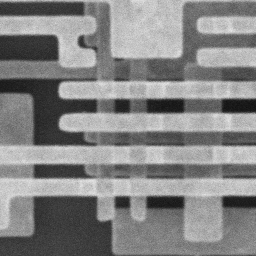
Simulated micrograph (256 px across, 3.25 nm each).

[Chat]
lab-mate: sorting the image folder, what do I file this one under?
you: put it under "wiring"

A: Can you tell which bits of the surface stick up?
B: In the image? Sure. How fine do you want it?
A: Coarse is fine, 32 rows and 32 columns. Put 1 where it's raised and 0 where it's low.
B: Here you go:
00000000000011111111111000000000
00000000000011111111111000000000
11111111111111111111111001111111
11111111111111111111111001111111
00000001110011111111111000000000
00000001110011111111111000000000
00000001111111111111111001111111
00000001111111001100000001111111
00000000000011001100000111110000
00000000000011001100000111110000
00000000111111111111111111111111
00000001111111111111111111111111
00000000000011101110000111110000
00000000000011001100000111110000
00000000111111111111111111111111
00000000111111111111111111111111
00000000000011101110000111110000
00000000000011001100000111110000
11111111111111111111111111111111
11111111111111111111111111111111
00000000000011101110000111110000
00000000000011001100000111110000
11111111111111111111111111111111
11111111111111111111111111111111
11000000000011101110000111110000
10000000000011001100000111110000
10000000000011001100000111110000
10000000000001000100000111110000
00000000000000000000000111110000
00000000000000000000000111110000
00000000000000000000000000000000
00000000000000000000000000000000